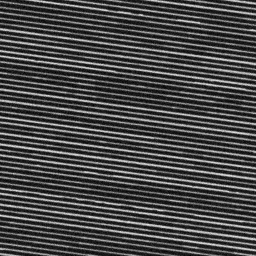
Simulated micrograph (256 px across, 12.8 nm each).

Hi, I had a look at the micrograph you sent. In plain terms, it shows parallel lines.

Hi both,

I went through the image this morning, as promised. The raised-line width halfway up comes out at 12.7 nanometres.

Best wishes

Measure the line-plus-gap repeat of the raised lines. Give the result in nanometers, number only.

69.6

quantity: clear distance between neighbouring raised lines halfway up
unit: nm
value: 55.5